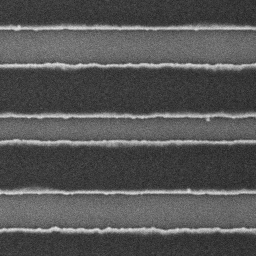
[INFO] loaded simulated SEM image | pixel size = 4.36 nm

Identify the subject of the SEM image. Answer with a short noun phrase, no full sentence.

lines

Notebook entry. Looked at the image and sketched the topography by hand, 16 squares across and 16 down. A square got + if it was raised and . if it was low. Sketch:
++++++++++++++++
++++++++++++++++
................
................
++++++++++++++++
++++++++++++++++
++++++++++++++++
................
................
++++++++++++++++
++++++++++++++++
++++++++++++++++
................
................
++++++++++++++++
++++++++++++++++